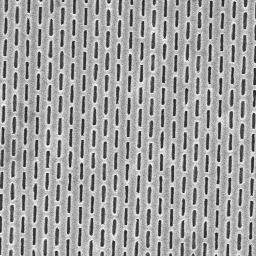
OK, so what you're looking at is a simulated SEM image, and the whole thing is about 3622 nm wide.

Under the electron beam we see a regular array of holes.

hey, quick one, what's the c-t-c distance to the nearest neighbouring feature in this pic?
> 15.5 px